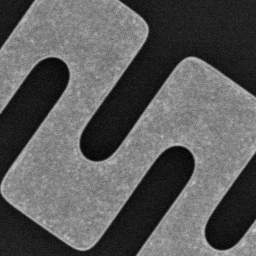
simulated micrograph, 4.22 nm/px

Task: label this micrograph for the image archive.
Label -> groups of lines, slits or small figures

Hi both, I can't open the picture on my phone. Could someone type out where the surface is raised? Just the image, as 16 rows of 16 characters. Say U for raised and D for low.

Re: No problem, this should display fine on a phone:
DDUUUUUUDDDDDDDD
DUUUUUUUUDDDDDDD
UUUUUUUUUDDDDDDD
UUUUUUUUDDDDDDDD
UUDDUUUUDDDUUUDD
UDDDUUUDDDUUUUUD
DDDDUUDDDUUUUUUU
DDDUUUDDDUUUUUUU
DDUUUDDDUUUUUUUU
DUUUUDDUUUDDUUUU
DUUUUUUUUDDDUUUD
UUUUUUUUUDDDUUDD
UUUUUUUUDDDUUUDD
DDUUUUUDDDUUUDDD
DDDUUUUDDDUUUDDU
DDDDDDDDDUUUUDUU